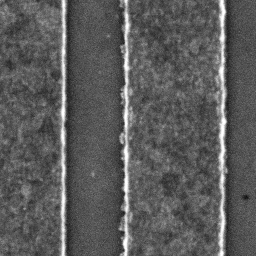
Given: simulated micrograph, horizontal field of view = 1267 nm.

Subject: one or a few lines or trenches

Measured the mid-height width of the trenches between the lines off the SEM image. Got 309 nanometers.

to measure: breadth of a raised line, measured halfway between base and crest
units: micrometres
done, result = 0.476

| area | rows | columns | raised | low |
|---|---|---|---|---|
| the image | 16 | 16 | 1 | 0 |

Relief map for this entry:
1111000011111100
1111000011111100
1111000011111100
1111000011111100
1111000011111100
1111000011111100
1111000011111100
1111000011111100
1111000011111100
1111000011111100
1111000011111100
1111000011111100
1111000011111100
1111000011111100
1111000011111100
1111000011111100